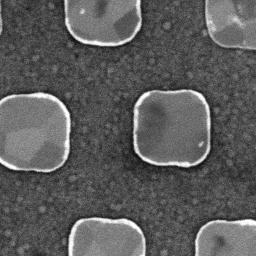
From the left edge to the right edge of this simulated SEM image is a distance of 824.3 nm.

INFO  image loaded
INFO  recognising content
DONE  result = raised bodies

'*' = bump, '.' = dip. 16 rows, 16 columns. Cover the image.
....*****.......
....*****.......
.....***........
................
................
................
****.....****...
****....*****...
****....*****...
****.....****...
.**.............
................
................
................
....*****....***
....*****...****